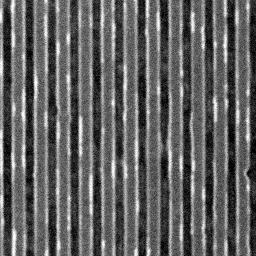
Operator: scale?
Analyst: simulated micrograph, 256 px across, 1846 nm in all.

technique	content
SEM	parallel lines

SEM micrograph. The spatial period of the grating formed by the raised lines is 162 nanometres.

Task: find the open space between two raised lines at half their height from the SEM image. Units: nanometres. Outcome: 67.6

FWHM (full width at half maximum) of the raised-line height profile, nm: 93.8